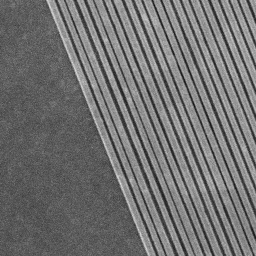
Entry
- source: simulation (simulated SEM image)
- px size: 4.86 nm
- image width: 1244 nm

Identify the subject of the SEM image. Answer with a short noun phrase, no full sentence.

parallel lines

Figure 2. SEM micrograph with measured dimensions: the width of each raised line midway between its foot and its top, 28.2 nm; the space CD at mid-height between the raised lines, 3.37 px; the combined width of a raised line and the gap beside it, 43.5 nm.